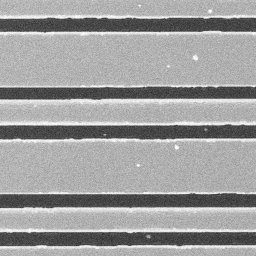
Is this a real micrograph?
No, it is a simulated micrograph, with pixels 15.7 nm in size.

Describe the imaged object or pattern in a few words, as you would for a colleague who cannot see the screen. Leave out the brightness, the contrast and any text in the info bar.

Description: lines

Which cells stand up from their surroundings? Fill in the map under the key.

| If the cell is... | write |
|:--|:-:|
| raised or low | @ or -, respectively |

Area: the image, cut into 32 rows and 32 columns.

@@@@@@@@@@@@@@@@@@@@@@@@@@@@@@@@
@@@@@@@@@@@@@@@@@@@@@@@@@@@@@@@@
--------------------------------
--------------------------------
@@@@@@@@@@@@@@@@@@@@@@@@@@@@@@@@
@@@@@@@@@@@@@@@@@@@@@@@@@@@@@@@@
@@@@@@@@@@@@@@@@@@@@@@@@@@@@@@@@
@@@@@@@@@@@@@@@@@@@@@@@@@@@@@@@@
@@@@@@@@@@@@@@@@@@@@@@@@@@@@@@@@
@@@@@@@@@@@@@@@@@@@@@@@@@@@@@@@@
@@@@@@@@@@@@@@@@@@@@@@@@@@@@@@@@
--------------------------------
--------------------------------
@@@@@@@@@@@@@@@@@@@@@@@@@@@@@@@@
@@@@@@@@@@@@@@@@@@@@@@@@@@@@@@@@
----------------@@@@@@--@-------
--------------------------------
-----------@@@@@@-----@@@@@@@@@@
@@@@@@@@@@@@@@@@@@@@@@@@@@@@@@@@
@@@@@@@@@@@@@@@@@@@@@@@@@@@@@@@@
@@@@@@@@@@@@@@@@@@@@@@@@@@@@@@@@
@@@@@@@@@@@@@@@@@@@@@@@@@@@@@@@@
@@@@@@@@@@@@@@@@@@@@@@@@@@@@@@@@
@@@@@@@@@@@@@@@@@@@@@@@@@@@@@@@@
--------------------------------
--------------------------------
@@@@@@@@@@@@@@@@@@@@@@@@@@@@@@@@
@@@@@@@@@@@@@@@@@@@@@@@@@@@@@@@@
@@@@@@@@@@@@@@@@@@@@@@@@@@@@@@@@
--------------------------------
--------------------------------
@@@@@@@@@@@@@@@@@@@@@@@@@@@@@@@@